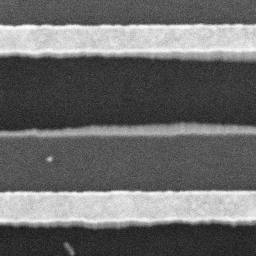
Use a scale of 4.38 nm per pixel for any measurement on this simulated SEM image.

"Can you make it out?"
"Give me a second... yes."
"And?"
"lines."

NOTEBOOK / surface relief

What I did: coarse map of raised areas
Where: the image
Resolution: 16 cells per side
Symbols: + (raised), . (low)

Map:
++++++++++++++++
++++++++++++++++
++++++++++++++++
................
................
................
................
................
++++++++++++++++
++++++++++++++++
++++++++++++++++
++++++++++++++++
++++++++++++++++
++++++++++++++++
................
................